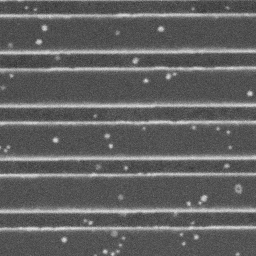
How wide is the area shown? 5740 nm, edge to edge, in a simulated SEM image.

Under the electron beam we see lines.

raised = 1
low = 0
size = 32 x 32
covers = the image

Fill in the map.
00000000000000000000000000000000
00000000000000000000000000000000
11111111111111111111111111111111
11111111111111111111111111111111
11111111111111111111111111111111
11111111111111111111111111111111
11111111100000000000000000000000
00000000000000000000000000000000
00000000000000000000000000000011
11111111111111111111111111111111
11111111111111111111111111111111
11111111111111111111111111111111
11111111111111111111111111111111
00000000000000000000000000000000
00000000000000000000000000000000
11111111111111111111111111111111
11111111111111111111111111111111
11111111111111111111111111111111
11111111111111111111111111111111
11111111111111111111111111111111
00000000000000000000000000000000
00000000000000000000000000000000
11111111111111111111111111111111
11111111111111111111111111111111
11111111111111111111111111111111
11111111111111111111111111111111
00000000000000000000000000000000
00000000000000000000000000000000
00000000000000000000000000011111
11111111111111111111111111111111
11111111111111111111111111111111
11111111111111111111111111111111